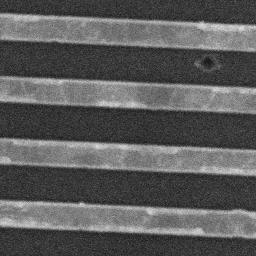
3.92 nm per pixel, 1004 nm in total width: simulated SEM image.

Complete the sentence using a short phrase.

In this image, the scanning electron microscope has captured parallel lines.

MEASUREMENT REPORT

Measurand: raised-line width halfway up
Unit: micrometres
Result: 0.0911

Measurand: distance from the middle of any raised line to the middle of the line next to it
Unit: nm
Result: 244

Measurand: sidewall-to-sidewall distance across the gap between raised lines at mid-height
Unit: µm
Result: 0.152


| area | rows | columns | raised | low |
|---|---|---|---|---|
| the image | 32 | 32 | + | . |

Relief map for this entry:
................................
................................
++++++++++++....................
++++++++++++++++++++++++++++++++
++++++++++++++++++++++++++++++++
................++++++++++++++++
................................
................................
................................
................................
++++++++++++++++................
++++++++++++++++++++++++++++++++
++++++++++++++++++++++++++++++++
...................+++++++++++++
................................
................................
................................
................................
+++++++++++++++++++++...........
++++++++++++++++++++++++++++++++
....++++++++++++++++++++++++++++
.........................+++++++
................................
................................
................................
+++++...........................
+++++++++++++++++++++++++++.....
++++++++++++++++++++++++++++++++
.........+++++++++++++++++++++++
............................+.++
................................
................................